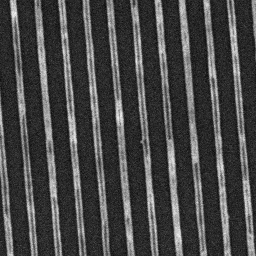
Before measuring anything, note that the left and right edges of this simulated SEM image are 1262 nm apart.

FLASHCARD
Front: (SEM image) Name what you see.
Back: parallel lines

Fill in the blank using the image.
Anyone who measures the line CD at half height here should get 0.0252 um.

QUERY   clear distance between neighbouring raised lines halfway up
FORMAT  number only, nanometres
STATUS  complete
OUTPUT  91.6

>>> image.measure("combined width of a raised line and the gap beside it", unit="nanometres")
119